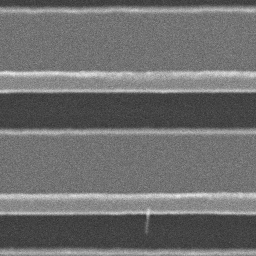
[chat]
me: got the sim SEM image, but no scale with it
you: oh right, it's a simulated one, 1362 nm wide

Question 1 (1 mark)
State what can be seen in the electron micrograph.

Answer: lines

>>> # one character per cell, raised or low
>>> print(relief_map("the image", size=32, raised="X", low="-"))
--------------------------------
XXXXXXXXXXXXXXXXXXXXXXXXXXXXXXXX
XXXXXXXXXXXXXXXXXXXXXXXXXXXXXXXX
XXXXXXXXXXXXXXXXXXXXXXXXXXXXXXXX
XXXXXXXXXXXXXXXXXXXXXXXXXXXXXXXX
XXXXXXXXXXXXXXXXXXXXXXXXXXXXXXXX
XXXXXXXXXXXXXXXXXXXXXXXXXXXXXXXX
XXXXXXXXXXXXXXXXXXXXXXXXXXXXXXXX
XXXXXXXXXXXXXXXXXXXXXXXXXXXXXXXX
XXXXXXXXXXXXXXXXXXXXXXXXXXXXXXXX
XXXXXXXXXXXXXXXXXXXXXXXXXXXXXXXX
--------------------------------
--------------------------------
--------------------------------
--------------------------------
--------------------------------
------------------X---X--------X
XXXXXXXXXXXXXXXXXXXXXXXXXXXXXXXX
XXXXXXXXXXXXXXXXXXXXXXXXXXXXXXXX
XXXXXXXXXXXXXXXXXXXXXXXXXXXXXXXX
XXXXXXXXXXXXXXXXXXXXXXXXXXXXXXXX
XXXXXXXXXXXXXXXXXXXXXXXXXXXXXXXX
XXXXXXXXXXXXXXXXXXXXXXXXXXXXXXXX
XXXXXXXXXXXXXXXXXXXXXXXXXXXXXXXX
XXXXXXXXXXXXXXXXXXXXXXXXXXXXXXXX
XXXXXXXXXXXXXXXXXXXXXXXXXXXXXXXX
XXXXXXXXXXXXXXXXXXXXXXXXXXXXXXXX
--------------------------------
--------------------------------
--------------------------------
--------------------------------
--------------------------------